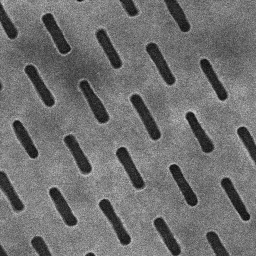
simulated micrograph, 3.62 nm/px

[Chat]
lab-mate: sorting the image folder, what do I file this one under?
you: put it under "a regular array of holes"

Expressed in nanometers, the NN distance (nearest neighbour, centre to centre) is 195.